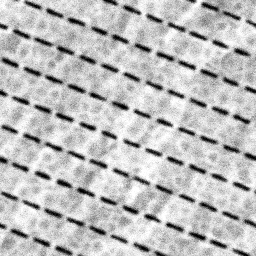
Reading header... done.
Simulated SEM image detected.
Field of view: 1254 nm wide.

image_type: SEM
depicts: a regular array of holes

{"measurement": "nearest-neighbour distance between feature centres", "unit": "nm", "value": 114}